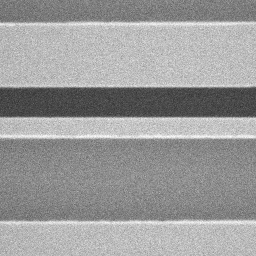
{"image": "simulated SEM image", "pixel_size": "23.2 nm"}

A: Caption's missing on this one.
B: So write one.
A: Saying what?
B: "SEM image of lines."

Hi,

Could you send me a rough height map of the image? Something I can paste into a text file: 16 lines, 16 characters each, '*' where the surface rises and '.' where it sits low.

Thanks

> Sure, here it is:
................
............****
****************
****************
****************
................
................
****************
****************
................
................
................
................
................
****************
****************